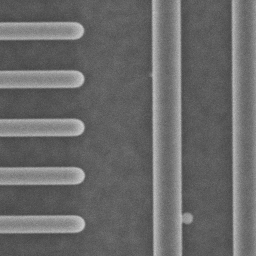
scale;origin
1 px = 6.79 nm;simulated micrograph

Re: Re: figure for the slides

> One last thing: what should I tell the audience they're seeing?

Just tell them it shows groups of lines, slits or small figures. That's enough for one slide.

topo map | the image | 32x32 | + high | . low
...................+++.......+++
...................+++.......+++
...................+++.......+++
++++++++++.........+++.......+++
++++++++++.........+++.......+++
...................+++.......+++
...................+++.......+++
...................+++.......+++
...................++++......+++
++++++++++.........++++......+++
++++++++++.........++++......+++
...................++++......+++
...................++++......+++
...................++++......+++
...................++++......+++
++++++++++.........++++......+++
++++++++++.........++++......+++
...................++++......+++
...................++++......+++
...................++++......+++
...................++++......+++
++++++++++.........++++......+++
++++++++++.........++++......+++
...................++++......+++
...................++++......+++
...................++++......+++
...................++++......+++
++++++++++.........++++......+++
++++++++++.........++++......+++
...................++++......+++
...................++++......+++
...................++++......+++